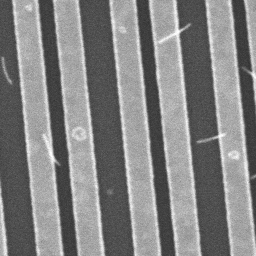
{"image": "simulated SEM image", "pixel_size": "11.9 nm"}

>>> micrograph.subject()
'lines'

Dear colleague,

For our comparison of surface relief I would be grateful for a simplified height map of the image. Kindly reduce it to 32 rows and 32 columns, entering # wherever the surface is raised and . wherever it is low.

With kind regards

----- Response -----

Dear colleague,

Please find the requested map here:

..###..###....###..###....###..#
..###..###....###..###....###..#
..###..###....###..###....###..#
..###..###....###..###....###..#
..###..###....###..###....###..#
..###..###....###..###....###..#
..###..###....###..####...####.#
..###..###....####.####...####.#
..####.####....###..###....###..
..####..###....###..###....###..
...###..###....###..###....###..
...###..###....###..###....###..
...###..###....###..###....###..
...###..###....###..###....###..
...###..###....###..###....###..
...###..###....###..###....###..
...###..###....###..####...####.
...###..####...####.####...####.
...####.####....###..###....###.
...####..###....###..###....###.
....###..###....###..###....###.
....###..###....###..###....###.
....###..###....###..###....###.
....###..###....###..###....###.
....###..###....###..###....###.
....###..###....###..###....###.
....###..###....####.####...####
....###..####...####.####...####
#...####.####....###..###....###
#...####..###....###..###....###
#...####..###....###..###....###
#....###..###....###..###....###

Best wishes